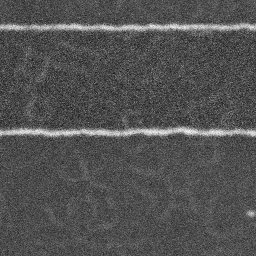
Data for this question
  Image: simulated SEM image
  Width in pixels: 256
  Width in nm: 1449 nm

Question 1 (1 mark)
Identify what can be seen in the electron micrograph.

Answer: one or a few lines or trenches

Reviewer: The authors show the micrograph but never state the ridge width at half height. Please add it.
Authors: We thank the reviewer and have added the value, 0.602 micrometres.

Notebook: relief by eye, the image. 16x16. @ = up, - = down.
----------------
----------------
@@@@@@@@@@@@@@@@
@@@@@@@@@@@@@@@@
@@@@@@@@@@@@@@@@
@@@@@@@@@@@@@@@@
@@@@@@@@@@@@@@@@
@@@@@@@@@@@@@@@@
----------------
----------------
----------------
----------------
----------------
----------------
----------------
----------------